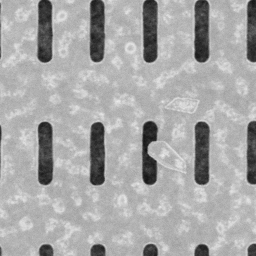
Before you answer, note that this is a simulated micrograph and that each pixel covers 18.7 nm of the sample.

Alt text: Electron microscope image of holes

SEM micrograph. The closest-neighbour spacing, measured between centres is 968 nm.